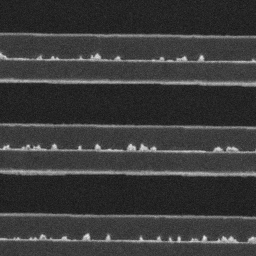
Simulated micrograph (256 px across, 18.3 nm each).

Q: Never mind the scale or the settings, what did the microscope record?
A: lines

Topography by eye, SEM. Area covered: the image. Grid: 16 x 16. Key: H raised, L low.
LLLLLLLLLLLLLLLL
LLLLLLLLLLLLLLLL
HHHHHHHHHHHHHHHH
HHHHHHHHHHHHHHHH
HHHHHHHHHHHHHHHH
LLLLLLLLLLLLLLLL
LLLLLLLLLLLLLLLL
LLLLLLLLLLLLLLLL
HHHHHHHHHHHHHHHH
HHHHHHHHHHHHHHHH
HHHHHHHHHHHHHHHH
LLLLLLLLLLLLLLLL
LLLLLLLLLLLLLLLL
HHHHHLLLLLLLLLLL
HHHHHHHHHHHHHHHH
HHHHHHHHHHHHHHHH